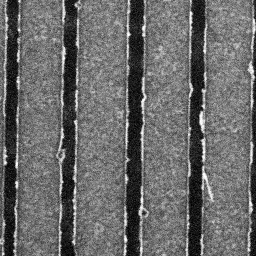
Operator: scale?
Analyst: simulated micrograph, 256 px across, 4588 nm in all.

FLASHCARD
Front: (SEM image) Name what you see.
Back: one or a few lines or trenches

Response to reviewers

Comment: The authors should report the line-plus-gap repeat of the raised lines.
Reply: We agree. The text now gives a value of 1110 nanometers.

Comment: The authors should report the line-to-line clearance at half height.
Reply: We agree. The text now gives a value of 817 nm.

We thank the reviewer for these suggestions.